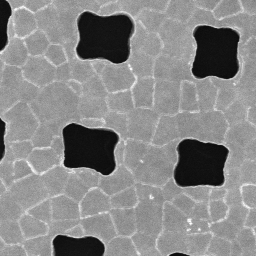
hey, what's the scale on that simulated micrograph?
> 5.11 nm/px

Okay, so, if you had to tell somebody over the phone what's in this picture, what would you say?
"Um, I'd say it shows holes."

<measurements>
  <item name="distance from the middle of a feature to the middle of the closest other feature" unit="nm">572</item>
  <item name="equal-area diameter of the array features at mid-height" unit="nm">269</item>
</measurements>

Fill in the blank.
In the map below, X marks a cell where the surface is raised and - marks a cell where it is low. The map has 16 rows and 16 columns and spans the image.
-XXXXXXXXXXXXXXX
XXXXX---XXXXXXXX
XXXXX---XXXX---X
XXXXX---XXXX---X
XXXXXXXXXXXX---X
XXXXXXXXXXXXXXXX
XXXXXXXXXXXXXXXX
XXXXXXXXXXXXXXXX
XXXX---XXXXXXXXX
XXXX---XXXX---XX
XXXXX--XXXX---XX
XXXXXXXXXXX---XX
XXXXXXXXXXXXXXXX
XXXXXXXXXXXXXXXX
XXXXXXXXXXXXXXXX
XXX---XXXXXXXXXX